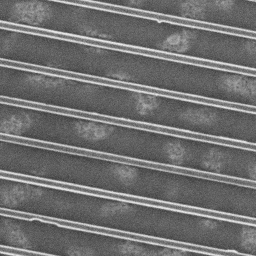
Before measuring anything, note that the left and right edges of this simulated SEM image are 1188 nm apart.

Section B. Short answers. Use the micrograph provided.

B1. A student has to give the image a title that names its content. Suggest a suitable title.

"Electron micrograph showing parallel lines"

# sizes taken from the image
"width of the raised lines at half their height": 6.53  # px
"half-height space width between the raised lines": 141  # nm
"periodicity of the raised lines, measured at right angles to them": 170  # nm